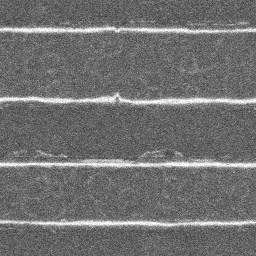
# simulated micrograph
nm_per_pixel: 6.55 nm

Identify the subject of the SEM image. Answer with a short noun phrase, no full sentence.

one or a few lines or trenches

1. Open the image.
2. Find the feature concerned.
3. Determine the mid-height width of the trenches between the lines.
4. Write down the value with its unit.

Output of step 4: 415 nanometres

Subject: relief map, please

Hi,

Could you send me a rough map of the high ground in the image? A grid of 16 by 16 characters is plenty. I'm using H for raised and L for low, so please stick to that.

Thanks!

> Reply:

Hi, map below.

LLLLLLLLLLLLLLLL
LLLLLLLLLLLLLLLL
HHHHHHHHHHHHHHHH
HHHHHHHHHHHHHHHH
HHHHHHHHHHHHHHHH
HHHHHHHHHHHHHHHH
LLLLLLLLLLLLLLLL
LLLLLLLLLLLLLLLL
LLLLLLLLLLLLLLLL
LLLLLLLLLLLLLLLL
HHHHHHHHHHHHHHHH
HHHHHHHHHHHHHHHH
HHHHHHHHHHHHHHHH
HHHHHHHHHHHHHHHH
LLLLLLLLLLLLLLLL
LLLLLLLLLLLLLLLL